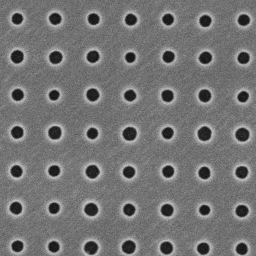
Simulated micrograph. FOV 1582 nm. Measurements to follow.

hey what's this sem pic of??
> a regular array of holes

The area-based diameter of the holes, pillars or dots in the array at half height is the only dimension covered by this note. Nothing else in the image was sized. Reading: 12.6 px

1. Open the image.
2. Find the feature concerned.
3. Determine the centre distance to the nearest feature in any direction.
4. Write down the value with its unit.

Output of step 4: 230 nanometres